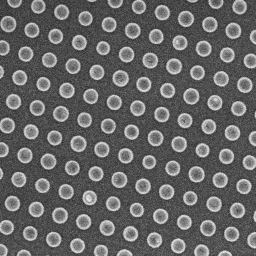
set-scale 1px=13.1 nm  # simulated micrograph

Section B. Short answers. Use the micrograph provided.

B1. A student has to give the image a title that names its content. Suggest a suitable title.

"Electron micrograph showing a regular array of raised bodies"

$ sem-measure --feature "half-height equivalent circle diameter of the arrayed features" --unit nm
182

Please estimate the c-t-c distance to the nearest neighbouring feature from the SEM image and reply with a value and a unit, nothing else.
319 nm